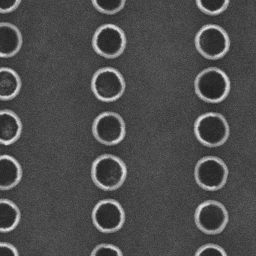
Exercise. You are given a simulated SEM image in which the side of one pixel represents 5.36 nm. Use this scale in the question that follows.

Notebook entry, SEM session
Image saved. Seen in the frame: a regular array of raised bodies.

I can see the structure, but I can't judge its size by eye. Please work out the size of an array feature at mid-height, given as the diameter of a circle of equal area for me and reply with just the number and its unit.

31.8 pixels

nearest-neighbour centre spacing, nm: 234